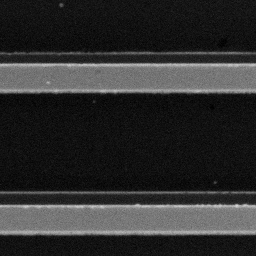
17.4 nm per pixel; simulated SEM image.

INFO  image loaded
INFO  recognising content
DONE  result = lines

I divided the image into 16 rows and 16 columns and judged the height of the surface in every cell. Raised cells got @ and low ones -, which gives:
----------------
----------------
----------------
@@@@@@@@@@@@@@@@
@@@@@@@@@@@@@@@@
@@@@@@@@@@@@@@@@
----------------
----------------
----------------
----------------
----------------
----------------
@@@@@@@@@@@@@@@@
@@@@@@@@@@@@@@@@
@@@@@@@--@-@--@-
----------------